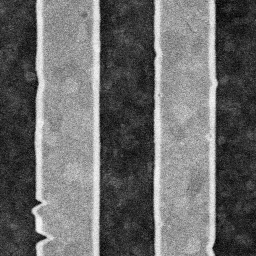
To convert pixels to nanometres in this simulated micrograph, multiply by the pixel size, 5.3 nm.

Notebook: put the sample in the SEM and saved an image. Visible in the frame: one or a few lines or trenches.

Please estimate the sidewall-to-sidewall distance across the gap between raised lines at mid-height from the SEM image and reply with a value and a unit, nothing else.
61.5 pixels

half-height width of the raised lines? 292 nanometers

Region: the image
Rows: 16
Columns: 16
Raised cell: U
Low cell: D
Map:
DDDUUUDDDDUUUDDD
DDDUUUDDDDUUUDDD
DDDUUUDDDDUUUDDD
DDDUUUDDDDUUUDDD
DDDUUUDDDDUUUDDD
DDDUUUDDDDUUUDDD
DDDUUUDDDDUUUDDD
DDUUUUDDDDUUUDDD
DDUUUUDDDDUUUDDD
DDDUUUDDDDUUUDDD
DDUUUUDDDDUUUDDD
DDUUUUDDDDUUUDDD
DDDUUUDDDDUUUDDD
DDUUUUDDDDUUUDDD
DDDUUUDDDDUUUDDD
DDDUUUDDDDUUUDDD